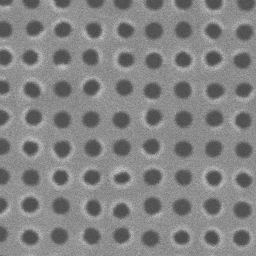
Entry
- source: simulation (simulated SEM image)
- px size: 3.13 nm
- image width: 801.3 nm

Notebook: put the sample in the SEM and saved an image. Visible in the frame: a regular array of holes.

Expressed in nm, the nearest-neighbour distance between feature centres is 88.9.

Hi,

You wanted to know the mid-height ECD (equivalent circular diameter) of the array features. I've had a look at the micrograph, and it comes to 53.4 nanometers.